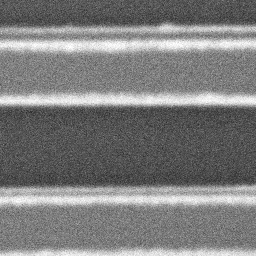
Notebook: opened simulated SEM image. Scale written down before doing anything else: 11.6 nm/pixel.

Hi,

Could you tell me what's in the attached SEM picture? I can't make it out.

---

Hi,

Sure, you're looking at lines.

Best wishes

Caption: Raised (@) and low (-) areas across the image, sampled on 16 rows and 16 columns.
----------------
----------------
@@@@@@@@@@@@@@@@
@@@@@@@@@@@@@@@@
@@@@@@@@@@@@@@@@
@@@@@@@@@@@@@@@@
----------------
----------------
----------------
----------------
----------------
----------------
@@@@@@@@@@@@@@@@
@@@@@@@@@@@@@@@@
@@@@@@@@@@@@@@@@
@@@@@@@@@@@@@@@@